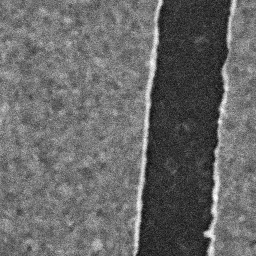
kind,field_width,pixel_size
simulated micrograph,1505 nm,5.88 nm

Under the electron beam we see one or a few lines or trenches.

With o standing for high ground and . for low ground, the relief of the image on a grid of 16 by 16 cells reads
oooooooooo.....o
oooooooooo....oo
oooooooooo....oo
oooooooooo....oo
oooooooooo....oo
ooooooooo.....oo
ooooooooo.....oo
ooooooooo.....oo
ooooooooo.....oo
ooooooooo.....oo
ooooooooo....ooo
ooooooooo.....oo
ooooooooo....ooo
ooooooooo....ooo
ooooooooo....ooo
ooooooooo....ooo